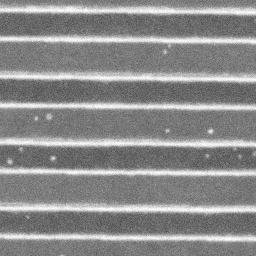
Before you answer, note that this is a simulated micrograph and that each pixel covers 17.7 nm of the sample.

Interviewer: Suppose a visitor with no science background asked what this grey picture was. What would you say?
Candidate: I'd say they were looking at lines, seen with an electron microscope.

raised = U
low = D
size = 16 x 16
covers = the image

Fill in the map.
UUUUUUUUUUUUUUUU
DDDDDDDDDDDDDDDD
UUDDDDDDDDDDDDDD
UUUUUUUUUUUUUUUU
UUUUUUUUUUUUUUUU
DDDDDDDDDDDDDDDD
DDDDDDDDDDDDDDDD
UUUUUUUUUUUUUUUU
UUUUUUUUUUUUUUUU
DDDDDDDDDDDDDDDD
DDDDDDDDDDDDDDDD
UUUUUUUUUUUUUUUU
UUUUUUUUUUUUUUUU
DDDDDDDDDDDDDDDD
DDDDDDDDDDDDDDDD
UUUUUUUUUUUUUUUU